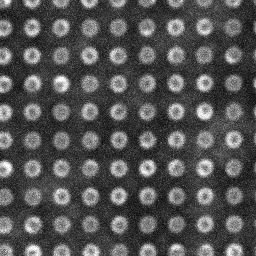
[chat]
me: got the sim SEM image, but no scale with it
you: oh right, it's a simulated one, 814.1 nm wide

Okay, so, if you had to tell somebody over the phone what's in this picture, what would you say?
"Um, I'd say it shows a regular array of raised bodies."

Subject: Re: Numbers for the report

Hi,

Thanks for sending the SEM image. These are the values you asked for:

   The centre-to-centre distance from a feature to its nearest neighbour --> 89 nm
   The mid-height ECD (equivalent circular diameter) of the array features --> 48.3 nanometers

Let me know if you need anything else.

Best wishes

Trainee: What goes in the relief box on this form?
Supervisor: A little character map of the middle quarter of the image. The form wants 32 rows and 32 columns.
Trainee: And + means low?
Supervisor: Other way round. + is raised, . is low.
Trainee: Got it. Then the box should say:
................................
................................
................................
.....+++....+++.....++.....++...
+....+++....+++....+++....++++..
+....+++....+++....+++....++++..
.....++.....+++.....++.....++...
................................
................................
................................
.....+++.....++.....++.....++...
+....+++....+++....++++...++++..
+....+++....+++....+++....++++..
.....++.....+++.....++.....++...
................................
................................
................................
......++.....++.....++.....++...
+....+++....+++....++++...++++..
+....+++....+++....++++...++++..
.....+++.....++.....++.....++...
................................
................................
................................
......+......++.....++.....++...
+....+++....+++....++++...++++..
+....+++....++++...++++...++++..
+....+++.....++.....++.....++...
................................
................................
................................
......++.....++.....++.....++...